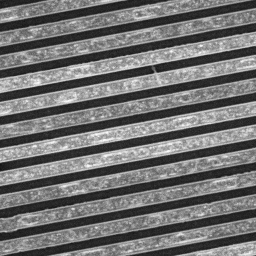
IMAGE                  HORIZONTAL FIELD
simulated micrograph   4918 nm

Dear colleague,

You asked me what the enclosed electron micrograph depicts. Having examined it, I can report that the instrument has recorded parallel lines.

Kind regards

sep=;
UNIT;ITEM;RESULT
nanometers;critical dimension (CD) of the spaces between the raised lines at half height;175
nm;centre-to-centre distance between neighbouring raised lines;439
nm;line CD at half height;260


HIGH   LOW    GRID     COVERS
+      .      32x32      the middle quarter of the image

..++++++++++++++++++............
++++++++++++++...............+++
+++++++++.............++++++++++
++++..............++++++++++++++
............+++++++++++++++++...
.......+++++++++++++++++........
..++++++++++++++++..............
+++++++++++++..............+++++
++++++++..............++++++++++
++..............++++++++++++++++
...........++++++++++++++++++...
......++++++++++++++++++........
++++++++++++++++++.............+
+++++++++++++.............++++++
+++++++.............++++++++++++
++.............+++++++++++++++++
..........++++++++++++++++++....
....++++++++++++++++++..........
+++++++++++++++++..............+
+++++++++++...............++++++
++++++..............++++++++++++
...............+++++++++++++++++
.........+++++++++++++++++......
....++++++++++++++++++..........
+++++++++++++++..............+++
++++++++++..............++++++++
++++...............+++++++++++++
.............++++++++++++++++++.
........++++++++++++++++++......
..++++++++++++++++++............
+++++++++++++++.............++++
++++++++++.............+++++++++